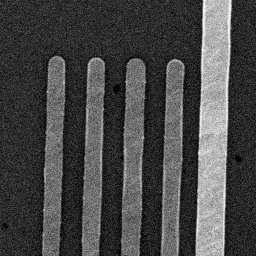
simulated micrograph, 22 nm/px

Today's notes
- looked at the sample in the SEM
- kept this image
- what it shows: groups of lines, slits or small figures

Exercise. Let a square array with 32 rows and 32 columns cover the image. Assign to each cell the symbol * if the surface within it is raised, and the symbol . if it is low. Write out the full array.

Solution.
..........................***...
..........................***...
..........................***...
..........................***...
.........................****...
.........................****...
.........................****...
......**.................****...
......**...**...**...**..***....
......**...**...**...**..***....
......**...**...**...**..***....
......**...**...**...**..***....
......**...**...**...**..***....
......**...**...**...**..***....
......**...**...**...**..***....
......**...**...**...**..***....
......**...**...**...**..***....
......**...**...**...**..***....
......**...**...**...**..***....
......**...**...**...**..***....
......**...**...**...**..***....
......**...**...**...**..***....
......**...**...**...*...***....
......**..***...**...*...***....
......**..***..***..**...***....
......**..**...***..**...***....
......*...**...***..**...***....
......*...**...***..**...***....
.....**...**...***..**...***....
.....**...**...**...**...***....
.....**...**...**...**...***....
.....**...**...**...**...***....